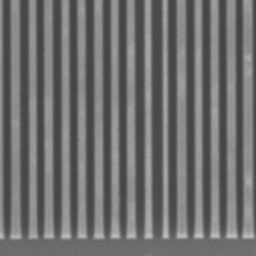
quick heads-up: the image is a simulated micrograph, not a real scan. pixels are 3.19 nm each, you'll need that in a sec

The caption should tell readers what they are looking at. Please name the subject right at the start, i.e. parallel lines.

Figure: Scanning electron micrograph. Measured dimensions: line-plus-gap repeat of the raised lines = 53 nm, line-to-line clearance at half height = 26.3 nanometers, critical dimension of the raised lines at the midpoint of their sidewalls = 0.0291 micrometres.